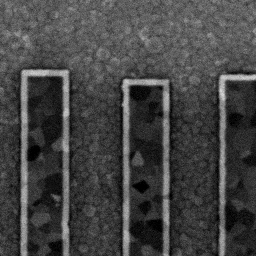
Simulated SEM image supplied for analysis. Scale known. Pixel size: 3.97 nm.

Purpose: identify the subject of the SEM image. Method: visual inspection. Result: one or a few lines or trenches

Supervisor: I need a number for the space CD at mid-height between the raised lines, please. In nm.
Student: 228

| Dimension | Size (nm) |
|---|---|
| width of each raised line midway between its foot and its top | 166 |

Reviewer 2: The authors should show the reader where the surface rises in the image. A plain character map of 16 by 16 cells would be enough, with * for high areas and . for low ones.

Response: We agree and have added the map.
................
................
................
................
................
..**....**....**
..**....**....**
..**....**....**
..**....**....**
.***....**....**
.***....**....**
.***....**....**
.***....**....**
.***....**....**
.***....**....**
.***....**....**